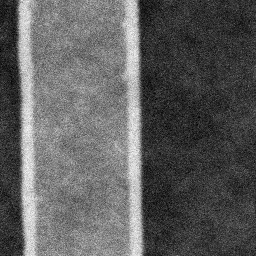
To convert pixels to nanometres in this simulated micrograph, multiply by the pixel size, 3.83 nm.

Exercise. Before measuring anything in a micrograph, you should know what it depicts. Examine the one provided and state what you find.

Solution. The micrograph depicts one or a few lines or trenches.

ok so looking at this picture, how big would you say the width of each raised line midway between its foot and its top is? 0.418 microns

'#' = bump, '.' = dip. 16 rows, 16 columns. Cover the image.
.#######........
.#######........
.#######........
..######........
..######........
..######........
..######........
..######........
..######........
..######........
..######........
..######........
..#######.......
..#######.......
..#######.......
..#######.......